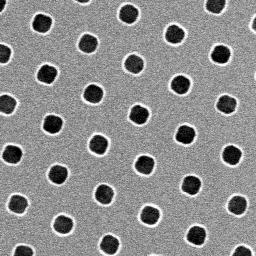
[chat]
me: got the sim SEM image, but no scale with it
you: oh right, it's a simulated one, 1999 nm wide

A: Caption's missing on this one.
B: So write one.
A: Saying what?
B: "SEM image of a regular array of holes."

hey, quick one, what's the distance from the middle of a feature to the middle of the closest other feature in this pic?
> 392 nanometers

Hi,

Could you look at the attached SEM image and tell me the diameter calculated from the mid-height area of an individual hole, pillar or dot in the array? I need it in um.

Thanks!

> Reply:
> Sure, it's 0.157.